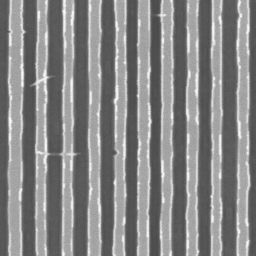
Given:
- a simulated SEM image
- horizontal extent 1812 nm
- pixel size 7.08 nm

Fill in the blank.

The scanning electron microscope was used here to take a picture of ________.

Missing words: parallel lines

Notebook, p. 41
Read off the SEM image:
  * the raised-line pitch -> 179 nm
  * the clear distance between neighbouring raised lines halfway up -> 87.6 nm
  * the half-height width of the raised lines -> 87.6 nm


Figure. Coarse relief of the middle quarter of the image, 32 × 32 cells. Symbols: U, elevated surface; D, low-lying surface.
UUUDDDUUUDDDDUUUDDUUUUDDUUUDDDDU
UUDDDDUUUDDDDUUUDDUUUUDDUUUDDDDU
UUDDDDUUUDDDDUUUDDUUUDDDUUUDDDDU
UUDDDDUUUDDDDUUUDDUUUDDDUUUDDDDU
UUDDDDUUUDDDDUUUDDUUUDDDUUUDDDDU
UUDDDDUUUDDDDUUUDDUUUDDDUUUDDDDU
UUDDDDUUUDDDDUUUDDUUUDDDUUUDDDDU
UUDDDDUUUDDDDUUUDDUUUDDDUUUDDDDU
UUDDDDUUUDDDUUUUDDUUUDDDUUUDDDUU
UUDDDDUUUDDDUUUUDDUUUDDDUUUDDDUU
UUDDDDUUUDDDDUUUDDUUUDDDUUUDDDUU
UUDDDDUUUDDDDUUUDDUUUUDDUUUDDDUU
UUDDDDUUUDDDDUUUDDUUUUDDUUUDDDUU
UUDDDDUUUDDDDUUUDDUUUUDDUUUDDDDU
UUDDDDUUUDDDDUUUDDUUUUDDUUUDDDDU
UUDDDDUUUDDDDUUUDDUUUUDDUUUDDDDU
UUDDDDUUUDDDDUUDDDUUUUDDUUUDDDDU
UUDDDDUUUDDDDUUDDDDUUUDDUUUDDDDU
UUDDDDUUUDDDDUUDDDDUUUDDUUUDDDDU
UUDDDDUUUDDDDUUDDDDUUDDDUUUDDDDU
UUDDDDUUUDDDDUUDDDDUUDDDUUUDDDDU
UUDDDDUUUDDDDUUDDDDUUDDDUUUDDDDU
UUUDDDUUUDDDDUUDDDDUUDDDUUUDDDUU
UUDDDDUUUDDDDUUDDDUUUDDDUUUDDDDU
UUDDDDUUUDDDDUUDDDDUUDDDUUUDDDDU
UUDDDDUUUDDDDUUDDDDUUUDDUUUDDDDU
UUDDDDUUUDDDDUUDDDUUUUDDUUUDDDDU
UUDDDDUUUDDDDUUDDDUUUUDDUUUDDDDU
UUDDDDUUUDDDDUUDDDUUUUDDUUUDDDDU
UUDDDDUUUDDDDUUDDDUUUUDDUUUDDDDU
UUDDDDUUUDDDDUUUDDUUUUDDUUUDDDDU
UUDDDDUUUDDDDUUUDDDUUUDDUUUDDDDU